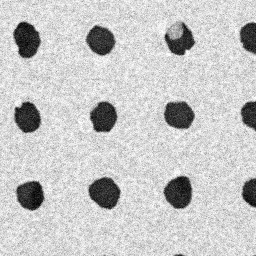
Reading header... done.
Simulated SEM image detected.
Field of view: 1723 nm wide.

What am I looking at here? a regular array of holes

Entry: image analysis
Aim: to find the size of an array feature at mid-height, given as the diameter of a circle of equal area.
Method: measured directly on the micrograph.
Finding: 0.209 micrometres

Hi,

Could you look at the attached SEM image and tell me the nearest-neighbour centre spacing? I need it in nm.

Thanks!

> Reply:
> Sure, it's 503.